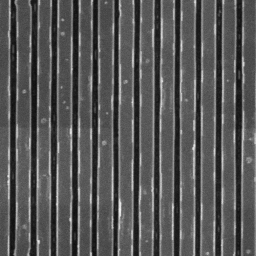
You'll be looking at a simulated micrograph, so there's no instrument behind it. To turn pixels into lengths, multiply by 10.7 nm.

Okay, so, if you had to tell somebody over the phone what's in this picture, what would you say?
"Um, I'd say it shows parallel lines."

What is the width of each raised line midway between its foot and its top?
0.145 um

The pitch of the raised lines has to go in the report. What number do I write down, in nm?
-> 220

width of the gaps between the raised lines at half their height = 68.4 nm